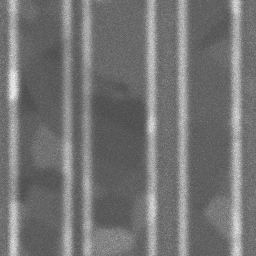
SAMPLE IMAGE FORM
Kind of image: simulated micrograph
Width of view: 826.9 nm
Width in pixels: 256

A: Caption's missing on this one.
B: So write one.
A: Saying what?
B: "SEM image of one or a few lines or trenches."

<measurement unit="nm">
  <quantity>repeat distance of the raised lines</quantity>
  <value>274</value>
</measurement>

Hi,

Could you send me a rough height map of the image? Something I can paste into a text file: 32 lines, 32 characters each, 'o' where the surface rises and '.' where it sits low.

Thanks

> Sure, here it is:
..oooooo...oooooooo....ooooooo..
..oooooo...oooooooo....ooooooo..
..oooooo...oooooooo....ooooooo..
..oooooo...oooooooo....ooooooo..
..oooooo...oooooooo....ooooooo..
..oooooo...oooooooo....ooooooo..
..oooooo...oooooooo....ooooooo..
..oooooo...oooooooo....ooooooo..
..oooooo...oooooooo....ooooooo..
..oooooo...oooooooo....ooooooo..
..oooooo...oooooooo....ooooooo..
..oooooo...oooooooo....ooooooo..
..oooooo...oooooooo....ooooooo..
..oooooo...oooooooo....ooooooo..
..oooooo...oooooooo....ooooooo..
..ooooooo..oooooooo....ooooooo..
..ooooooo..oooooooo....ooooooo..
..ooooooo..oooooooo....ooooooo..
..oooooo...oooooooo....ooooooo..
..oooooo...oooooooo....ooooooo..
..oooooo...oooooooo....ooooooo..
..oooooo...oooooooo....ooooooo..
..ooooooo..oooooooo....ooooooo..
..ooooooo..oooooooo....ooooooo..
..ooooooo..oooooooo....ooooooo..
..ooooooo..oooooooo....ooooooo..
..ooooooo..oooooooo....ooooooo..
..ooooooo..oooooooo....ooooooo..
..ooooooo..oooooooo....ooooooo..
..ooooooo..oooooooo....ooooooo..
..ooooooo..oooooooo....ooooooo..
..ooooooo..oooooooo....ooooooo..